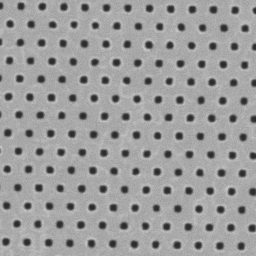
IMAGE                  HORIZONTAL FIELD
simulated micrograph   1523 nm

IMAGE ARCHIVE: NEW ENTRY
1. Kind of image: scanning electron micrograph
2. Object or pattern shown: a regular array of holes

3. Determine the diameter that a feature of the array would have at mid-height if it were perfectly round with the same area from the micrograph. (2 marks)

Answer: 45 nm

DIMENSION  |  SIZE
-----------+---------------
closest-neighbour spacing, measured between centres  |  124 nm